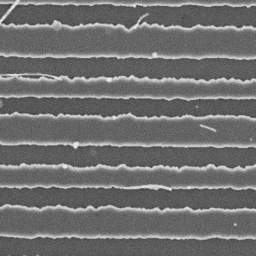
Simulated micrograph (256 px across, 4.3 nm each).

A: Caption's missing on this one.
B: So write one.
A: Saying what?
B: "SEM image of lines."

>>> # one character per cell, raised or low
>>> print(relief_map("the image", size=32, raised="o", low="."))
.oooooooooooo.oooooooooooooooooo
................................
................................
ooooooooooooooooooooooo.oooooooo
oooooooooooooooooooooooooooooooo
oooooooooooooooooooooooooooooooo
oooooooooooooooooooooooooooooooo
................................
................................
.o..............................
oooooooooooooooooooooooooooooooo
oooooooooooooooooooooooooooooooo
.......................o........
................................
oooooooooooo...oo......o..ooooo.
oooooooooooooooooooooooooooooooo
oooooooooooooooooooooooooooooooo
oooooooooooooooooooooooooooooooo
................................
................................
................................
oooooooooooooooooooooooooooooooo
oooooooooooooooooooooooooooooooo
...............ooooooooooooo.ooo
................................
................................
oooooooooooooooooooooooooooooooo
oooooooooooooooooooooooooooooooo
oooooooooooooooooooooooooooooooo
oooooooooooooooooooooooooooooooo
................................
................................